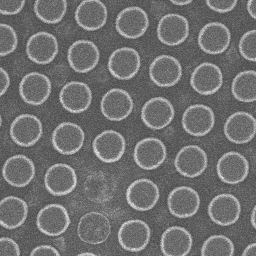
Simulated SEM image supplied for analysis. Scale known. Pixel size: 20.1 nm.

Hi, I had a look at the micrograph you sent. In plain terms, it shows a regular array of raised bodies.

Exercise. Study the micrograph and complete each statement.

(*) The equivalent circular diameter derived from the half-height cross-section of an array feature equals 0.612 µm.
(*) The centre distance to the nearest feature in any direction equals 41.3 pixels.